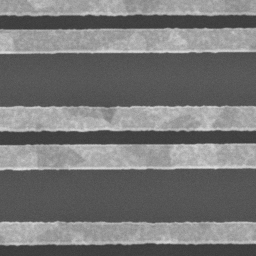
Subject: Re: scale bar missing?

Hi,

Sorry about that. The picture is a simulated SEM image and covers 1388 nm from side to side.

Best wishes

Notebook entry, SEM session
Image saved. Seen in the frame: lines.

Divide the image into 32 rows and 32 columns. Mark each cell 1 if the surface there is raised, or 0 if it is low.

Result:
11111111111111111111111111111111
11111111111111111111111111111111
00000000000000000000000000000000
00000000000000000000000000000000
11111111111111111111111111111111
11111111111111111111111111111111
11111111111111111111111101100000
00000000000000000000000000000000
00000000000000000000000000000000
00000000000000000000000000000000
00000000000000000000000000000000
00000000000000000000000000000000
00000000000000000000000000000000
11111111111111111111111111111111
11111111111111111111111111111111
11111111111111111111111111111111
00000000000000000000000000000000
00000000000000000000000000000000
11111111111111111111111111111111
11111111111111111111111111111111
11111111111111111111111111111111
00000000000000000000000000000000
00000000000000000000000000000000
00000000000000000000000000000000
00000000000000000000000000000000
00000000000000000000000000000000
00000000000000000000000000000000
00000000000000000000000000000000
11111111111111111111111111111111
11111111111111111111111111111111
11111111101110001000000000000000
00000000000000000000000000000000